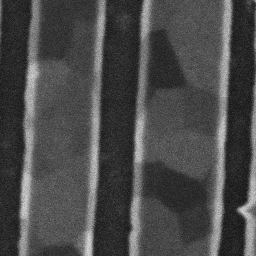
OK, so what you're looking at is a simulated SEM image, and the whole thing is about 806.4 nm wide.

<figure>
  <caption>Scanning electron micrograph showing one or a few lines or trenches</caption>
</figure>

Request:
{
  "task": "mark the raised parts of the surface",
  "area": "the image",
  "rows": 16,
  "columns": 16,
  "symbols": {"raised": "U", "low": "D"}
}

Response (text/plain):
DDUUUUDDDUUUUUDD
DDUUUUDDDUUUUUDD
DDUUUUDDDUUUUUDD
DDUUUUDDDUUUUUDD
DDUUUUDDDUUUUUDD
DDUUUUDDDUUUUUDD
DDUUUUDDDUUUUUDD
DDUUUUDDDUUUUUDD
DDUUUUDDDUUUUUDD
DDUUUUDDDUUUUUDD
DDUUUUDDDUUUUUDD
DDUUUUDDDUUUUUDD
DDUUUUDDUUUUUUDD
DUUUUUDDUUUUUUDU
DUUUUUDDUUUUUUDD
DUUUUUDDUUUUUDDD